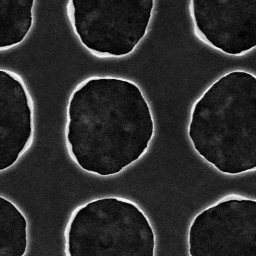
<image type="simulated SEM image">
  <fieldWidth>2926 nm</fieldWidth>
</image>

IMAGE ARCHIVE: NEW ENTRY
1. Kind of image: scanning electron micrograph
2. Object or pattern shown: holes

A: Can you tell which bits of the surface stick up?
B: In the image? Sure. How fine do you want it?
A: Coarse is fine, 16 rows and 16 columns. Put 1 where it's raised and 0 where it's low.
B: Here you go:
0011000001110000
0011100001110000
0111100001111000
1111111111111111
1111111111111111
0111100001111000
0011000001110000
0011000001110000
0011000001110000
0111000001110000
1111100011111100
1111111111111111
1111110111111100
0111100001110000
0011000000110000
0011000000110000